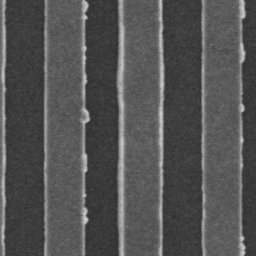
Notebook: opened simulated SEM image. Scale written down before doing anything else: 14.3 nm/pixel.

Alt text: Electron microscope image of lines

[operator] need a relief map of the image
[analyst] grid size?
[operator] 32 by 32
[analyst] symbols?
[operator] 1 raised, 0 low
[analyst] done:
10000011111000011111000001111100
00000011111000011111000001111110
00000011111000011111000001111100
10000011110000011111000001111100
10000011110000011111000001111100
10000011111000011111000001111100
10000011111000011111000001111110
10000011111000011111000001111100
00000011111000011111000001111100
00000011111000011111000001111100
00000011111000011111000001111100
10000011111000011111000001111100
00000011111000011111000001111100
00000011111000011111000001111100
10000011111000011111000001111100
10000011111000011111000001111100
10000011111000011111000001111100
00000011110000011111000001111100
10000011110000011111000001111100
10000011111000011111000001111100
10000011111000011111000001111100
00000011111000011111000001111100
00000011110000011111000001111100
00000011110000011111000001111100
10000011111000011111000001111100
10000011111000011111000001111100
00000011111000011111000001111100
00000011111000011111000001111100
00000011110000011111000001111100
00000011110000011111000001111100
00000011111000011111000001111100
00000011110000011111000001111110